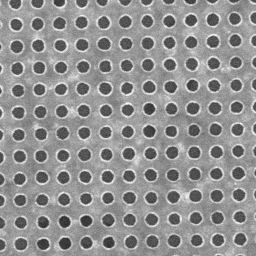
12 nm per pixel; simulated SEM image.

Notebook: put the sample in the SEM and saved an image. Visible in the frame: a regular array of holes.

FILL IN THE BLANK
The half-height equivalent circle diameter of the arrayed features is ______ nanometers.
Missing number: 154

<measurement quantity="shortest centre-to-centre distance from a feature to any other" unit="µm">0.258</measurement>